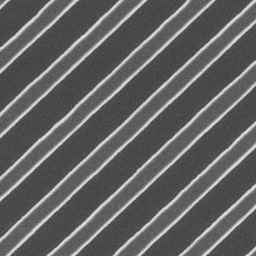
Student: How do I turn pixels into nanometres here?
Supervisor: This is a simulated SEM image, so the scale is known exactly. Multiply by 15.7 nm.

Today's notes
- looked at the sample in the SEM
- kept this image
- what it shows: lines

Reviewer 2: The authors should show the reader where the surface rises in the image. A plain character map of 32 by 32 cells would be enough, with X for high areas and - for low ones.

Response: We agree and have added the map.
X-----XXX------XXX-----XXX-----X
-----XXX------XXX-----XXX-----XX
----XXX-----XXXX-----XXX-----XXX
---XXX-----XXXX-----XXX-----XXX-
--XXX-----XXX------XXX-----XXX--
-XXX-----XXX------XXX-----XXX---
XXX-----XXX------XXX-----XXX----
XX-----XXX------XXX-----XXX-----
X-----XXX------XXX-----XXX-----X
-----XXX------XXX-----XXX-----XX
----XXX-----XXXX-----XXX-----XXX
---XXX-----XXXX-----XXX-----XXX-
--XXX-----XXX-----XXXX-----XXX--
-XXX-----XXX-----XXXX-----XXX---
XXX-----XXX-----XXX------XXX----
XX-----XXX-----XXX-----XXXX-----
X-----XXX-----XXX-----XXXX-----X
-----XXX-----XXX-----XXXX-----XX
----XXX-----XXX-----XXX------XXX
---XXX-----XXX-----XXX-----XXXX-
--XXX-----XXX-----XXX-----XXXX--
-XXX-----XXX-----XXX-----XXXX---
XXX-----XXX-----XXX-----XXX-----
XX-----XXX-----XXX-----XXX------
X-----XXX-----XXX-----XXX-----XX
-----XXX-----XXX-----XXX-----XXX
----XXX-----XXX-----XXX-----XXX-
---XXX-----XXX-----XXX-----XXX--
--XXX-----XXX-----XXX-----XXX---
-XXX-----XXX-----XXX-----XXX----
XXX-----XXX-----XXX-----XXX-----
XX-----XXX-----XXX-----XXX-----X